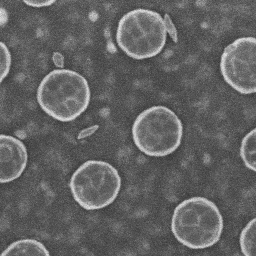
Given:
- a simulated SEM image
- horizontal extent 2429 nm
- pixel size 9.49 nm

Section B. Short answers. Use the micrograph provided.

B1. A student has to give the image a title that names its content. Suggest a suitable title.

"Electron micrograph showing raised bodies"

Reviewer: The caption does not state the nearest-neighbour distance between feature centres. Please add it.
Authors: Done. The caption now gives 908 nanometres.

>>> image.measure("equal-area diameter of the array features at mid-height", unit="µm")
0.461